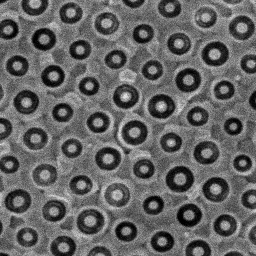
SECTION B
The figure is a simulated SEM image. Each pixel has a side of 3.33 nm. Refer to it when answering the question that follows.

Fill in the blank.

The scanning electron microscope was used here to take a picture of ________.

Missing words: a regular array of ring-shaped grooves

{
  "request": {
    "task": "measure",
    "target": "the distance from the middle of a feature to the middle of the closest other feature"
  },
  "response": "123 nm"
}